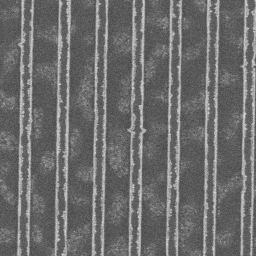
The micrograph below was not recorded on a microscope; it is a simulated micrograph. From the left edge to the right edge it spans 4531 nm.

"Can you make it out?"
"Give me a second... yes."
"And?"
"parallel lines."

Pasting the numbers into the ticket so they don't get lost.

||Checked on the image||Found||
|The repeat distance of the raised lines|0.658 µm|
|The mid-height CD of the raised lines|181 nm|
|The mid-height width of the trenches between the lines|0.48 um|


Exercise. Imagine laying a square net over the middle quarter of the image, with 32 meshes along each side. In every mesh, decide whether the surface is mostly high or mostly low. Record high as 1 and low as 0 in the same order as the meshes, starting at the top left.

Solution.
10000000110000000111000000011000
10000000110000000111000000011000
10000000110000000111000000011000
10000000110000000111000000011000
10000000110000000111000000011000
10000000110000000111000000011000
10000000110000000111000000011000
10000000110000000111000000111000
10000000110000000111000000111000
10000000110000000110000000111000
10000000110000000110000000011000
10000000110000000110000000111000
10000000110000000110000000111000
10000000110000000110000000111000
10000000110000000110000000111000
10000000110000000111000000111000
10000000110000001111000000111000
10000000110000000111000000111000
10000000110000000110000000111000
10000000110000000110000000111000
10000000110000000110000000111000
10000000110000000110000000111000
10000000110000000110000000111000
10000000110000000110000000111000
10000000110000000110000000111000
10000000110000000110000000111000
10000000110000000110000000111000
10000000110000000110000000110000
10000001110000000110000000111000
10000000110000000110000000110000
10000000110000000110000000110000
10000000110000000110000000110000